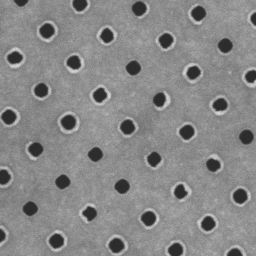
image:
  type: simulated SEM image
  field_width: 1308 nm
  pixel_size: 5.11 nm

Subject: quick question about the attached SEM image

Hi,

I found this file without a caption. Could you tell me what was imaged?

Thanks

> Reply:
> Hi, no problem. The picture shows a regular array of holes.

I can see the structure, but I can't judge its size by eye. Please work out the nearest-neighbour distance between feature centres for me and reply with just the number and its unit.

0.213 um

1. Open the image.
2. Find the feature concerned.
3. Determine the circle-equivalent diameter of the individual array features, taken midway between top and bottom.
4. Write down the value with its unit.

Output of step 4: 0.073 um